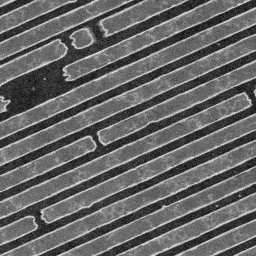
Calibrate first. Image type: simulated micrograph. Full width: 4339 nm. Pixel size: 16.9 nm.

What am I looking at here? parallel lines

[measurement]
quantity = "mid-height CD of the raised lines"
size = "14.9 pixels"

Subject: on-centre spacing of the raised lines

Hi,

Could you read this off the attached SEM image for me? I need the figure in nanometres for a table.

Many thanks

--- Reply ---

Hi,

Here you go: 410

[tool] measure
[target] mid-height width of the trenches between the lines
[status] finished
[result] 168 nm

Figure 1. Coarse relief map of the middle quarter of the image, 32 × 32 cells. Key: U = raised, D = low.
DUUUUUUUUUDDDDDDUUUUUUUUDDDDDDDU
UUUUUUUUDDDDDUUUUUUUUUDDDDDDUUUU
UUUUUDDDDDDUUUUUUUUUDDDDDDUUUUUU
DUUDDDDDDUUUUUUUUUDDDDDDUUUUUUUU
DDDDDDDUUUUUUUUUDDDDDDUUUUUUUUDD
DDDDUUUUUUUUUDDDDDDDUUUUUUUUDDDD
DDUUUUUUUUUDDDDDDUUUUUUUUUDDDDDD
UUUUUUUUUDDDDDDUUUUUUUUUDDDDDDUU
UUUUUUUDDDDDUUUUUUUUUUDDDDDUUUUU
UUUUDDDDDDUUUUUUUUUUDDDDDUUUUUUU
UUDDDDDDUUUUUUUUUDDDDDDUUUUUUUUU
DDDDDDUUUUUUUUUDDDDDDUUUUUUUUUDD
DDDDUUUUUUUUDDDDDDDUUUUUUUUUDDDD
DDUUUUUUUUDDDDDDUUUUUUUUUDDDDDDU
UUUUUUUUDDDDDDUUUUUUUUDDDDDDDUUU
UUUUUUDDDDDDUUUUUUUUDDDDDDDUUUUU
UUUUDDDDDDUUUUUUUUDDDDDDUUUUUUUU
UDDDDDDDDUUUUUUUDDDDDDUUUUUUUUUD
DDDDDUUDDUUUUUDDDDDDUUUUUUUUUDDD
DDDUUUUDDUUUDDDDDDUUUUUUUUDDDDDD
DUUUUUUUDDDDDDDUUUUUUUUUDDDDDDUU
UUUUUUUDDDDDDUUUUUUUUUDDDDDDUUUU
UUUUUDDDDDDUUUUUUUUUDDDDDDUUUUUU
UUUDDDDDUUUUUUUUUDDDDDDDUUUUUUUU
DDDDDDDUUUUUUUUUDDDDDUUUUUUUUUDD
DDDDDUUUUUUUUDDDDDDUUUUUUUUUDDDD
DDUUUUUUUUUDDDDDDUUUUUUUUUDDDDDD
UUUUUUUUDDDDDDDUUUUUUUUUDDDDDUUU
UUUUUUUDDDDDDUUUUUUUUDDDDDDUUUUU
UUUUDDDDDDUUUUUUUUUDDDDDDUUUUUUU
UUDDDDDDUUUUUUUUUDDDDDDUUUUUUUUD
DDDDDDUUUUUUUUDDDDDDDUUUUUUUUDDD